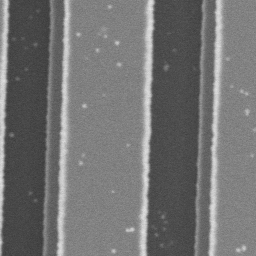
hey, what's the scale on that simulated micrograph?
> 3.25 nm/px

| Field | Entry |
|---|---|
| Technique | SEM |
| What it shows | lines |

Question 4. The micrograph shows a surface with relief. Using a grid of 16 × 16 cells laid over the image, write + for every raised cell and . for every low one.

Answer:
....++++++...+++
....++++++...+++
....++++++...+++
....+++++....+++
....+++++....+++
....+++++....+++
....+++++....+++
....+++++....+++
....+++++....+++
....+++++....+++
....+++++....+++
....+++++....+++
....+++++....+++
....+++++....+++
....+++++....+++
....+++++....+++